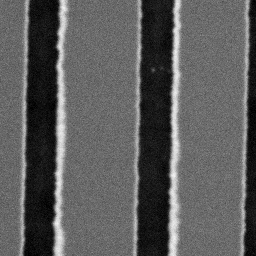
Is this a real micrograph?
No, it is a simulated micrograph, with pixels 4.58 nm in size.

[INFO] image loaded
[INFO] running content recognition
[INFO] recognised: lines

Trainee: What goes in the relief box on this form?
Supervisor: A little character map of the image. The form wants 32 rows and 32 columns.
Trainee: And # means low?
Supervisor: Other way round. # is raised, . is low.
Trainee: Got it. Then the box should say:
####....##########....#########.
###.....##########....#########.
###.....##########....#########.
###....###########....#########.
###....##########.....#########.
###....###########....#########.
###....###########....#########.
###....##########.....#########.
###....##########.....#########.
###....##########.....#########.
###....##########.....#########.
###....##########.....#########.
###....##########.....#########.
###....##########.....#########.
###....##########....##########.
###....##########....##########.
###....##########.....#########.
###....##########.....#########.
###....##########.....#########.
###....##########....##########.
###....##########....##########.
###....##########....##########.
###....##########....##########.
###....##########....##########.
###....##########....##########.
###....##########....##########.
###....##########....##########.
###....##########....##########.
###....##########....##########.
###....##########....#########..
###....##########....#########..
###....##########....#########..